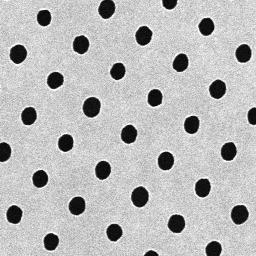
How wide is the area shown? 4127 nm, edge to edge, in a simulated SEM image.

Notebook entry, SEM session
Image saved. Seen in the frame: a regular array of holes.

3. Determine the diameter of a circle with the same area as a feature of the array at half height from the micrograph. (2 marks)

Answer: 285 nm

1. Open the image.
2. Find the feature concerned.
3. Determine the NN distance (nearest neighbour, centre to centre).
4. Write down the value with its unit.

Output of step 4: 710 nanometers